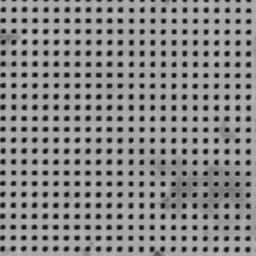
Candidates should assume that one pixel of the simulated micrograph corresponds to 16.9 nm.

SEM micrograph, a regular array of holes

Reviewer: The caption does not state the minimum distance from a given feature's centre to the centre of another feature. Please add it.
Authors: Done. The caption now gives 0.173 µm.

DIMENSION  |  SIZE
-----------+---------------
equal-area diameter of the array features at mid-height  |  97.4 nanometres